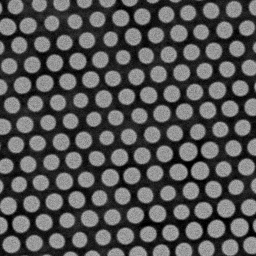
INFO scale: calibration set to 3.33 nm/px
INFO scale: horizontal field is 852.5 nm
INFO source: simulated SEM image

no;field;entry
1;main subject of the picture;an array of small figures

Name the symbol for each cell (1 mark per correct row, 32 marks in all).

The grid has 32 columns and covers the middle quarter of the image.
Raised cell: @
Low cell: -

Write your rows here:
--@@@---@@------------------@@--
-----------------@@---@@@---@@@-
-----@@@---@@@--@@@@--@@@@--@@@-
@@@--@@@@-@@@@--@@@@--@@@---@@@-
@@@--@@@@--@@@---@@-------------
@@@--@@@-----------------------@
---------------@@---@@@--@@@@--@
----@---@@@@--@@@@-@@@@--@@@@--@
---@@@--@@@@--@@@@-@@@@--@@@@--@
---@@@--@@@@--@@@---@@----------
---@@----@@-------------@----@@-
------------------@@---@@@--@@@@
------@@@--@@@@--@@@@--@@@--@@@@
@@@---@@@--@@@@--@@@@--@@@---@@-
@@@---@@@--@@@----@@------------
@@@----@------------------------
---------------@@----@@@--@@@---
----@@---@@@---@@@--@@@@--@@@@--
@--@@@@--@@@--@@@@--@@@@--@@@---
@--@@@@--@@@---@@@---@@---------
@---@@------------------------@@
--------------@---@@@--@@@@--@@@
-@@@---@@---@@@@--@@@--@@@@--@@@
-@@@--@@@@--@@@@--@@@---@@@--@@@
-@@@---@@@--@@@@--@@@-----------
-@@@-----------------------@@@--
-----------@----@@---@@@@--@@@@-
@---@@@---@@@--@@@@--@@@@--@@@@-
@@--@@@---@@@@-@@@@--@@@---@@@--
@@--@@@---@@@---@@--------------
@@---@@-----------------------@@
-------------@@@---@@@--@@@@--@@